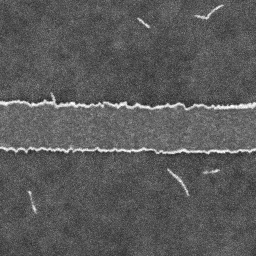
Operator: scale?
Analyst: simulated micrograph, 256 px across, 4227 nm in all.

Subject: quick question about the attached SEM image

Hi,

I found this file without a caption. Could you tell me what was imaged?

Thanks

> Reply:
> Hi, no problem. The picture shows one or a few lines or trenches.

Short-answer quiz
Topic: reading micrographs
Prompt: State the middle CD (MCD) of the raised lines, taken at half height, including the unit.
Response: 760 nm